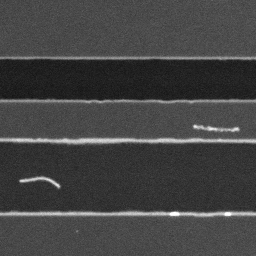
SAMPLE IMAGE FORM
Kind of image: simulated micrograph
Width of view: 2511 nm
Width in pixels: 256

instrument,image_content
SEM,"lines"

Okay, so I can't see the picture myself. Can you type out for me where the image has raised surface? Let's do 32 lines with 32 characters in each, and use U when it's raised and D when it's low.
UUUUUUUUUUUUUUUUUUUUUUUUUUUUUUUU
UUUUUUUUUUUUUUUUUUUUUUUUUUUUUUUU
UUUUUUUUUUUUUUUUUUUUUUUUUUUUUUUU
UUUUUUUUUUUUUUUUUUUUUUUUUUUUUUUU
UUUUUUUUUUUUUUUUUUUUUUUUUUUUUUUU
UUUUUUUUUUUUUUUUUUUUUUUUUUUUUUUU
UUUUUUUUUUUUUUUUUUUUUUUUUUUUUUUU
DDDDDDDDDDDDDDDDDDDDDDDDDDDDDDDD
DDDDDDDDDDDDDDDDDDDDDDDDDDDDDDDD
DDDDDDDDDDDDDDDDDDDDDDDDDDDDDDDD
DDDDDDDDDDDDDDDDDDDDDDDDDDDDDDDD
DDDDDDDDDDDDDDDDDDDDDDDDDDDDDDDD
DDDDDDDDDDDDDDDDDDDDDDDDDDDDDDDD
UUUUUUUUUUUUUUUUUUUUUUUUUUUUUUUU
UUUUUUUUUUUUUUUUUUUUUUUUUUUUUUUU
UUUUUUUUUUUUUUUUUUUUUUUUUUUUUUUU
UUUUUUUUUUUUUUUUUUUUUUUUUUUUUUUU
DDDDDDDDDDDDDDDDDDDDDDDDDDDDDDDD
DDDDDDDDDDDDDDDDDDDDDDDDDDDDDDDD
DDDDDDDDDDDDDDDDDDDDDDDDDDDDDDDD
DDDDDDDDDDDDDDDDDDDDDDDDDDDDDDDD
DDDDDDDDDDDDDDDDDDDDDDDDDDDDDDDD
DDDDDDDDDDDDDDDDDDDDDDDDDDDDDDDD
DDDDDDDDDDDDDDDDDDDDDDDDDDDDDDDD
DDDDDDDDDDDDDDDDDDDDDDDDDDDDDDDD
DDDDDDDDDDDDDDDDDDDDDDDDDDDDDDDD
DDDDDDDDDDDDDDDDDDDDDDDDDDDDDDDD
UUUUUUUUUUUUUUUUUUUUUUUUUUUUUUUU
UUUUUUUUUUUUUUUUUUUUUUUUUUUUUUUU
UUUUUUUUUUUUUUUUUUUUUUUUUUUUUUUU
UUUUUUUUUUUUUUUUUUUUUUUUUUUUUUUU
UUUUUUUUUUUUUUUUUUUUUUUUUUUUUUUU